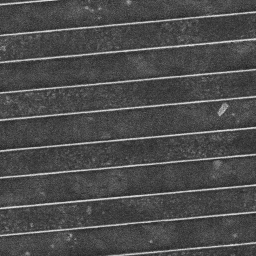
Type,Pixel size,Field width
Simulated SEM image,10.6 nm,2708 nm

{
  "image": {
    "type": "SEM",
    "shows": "parallel lines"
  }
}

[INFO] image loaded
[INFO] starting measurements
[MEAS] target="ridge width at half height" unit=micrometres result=0.287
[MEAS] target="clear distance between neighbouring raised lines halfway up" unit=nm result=317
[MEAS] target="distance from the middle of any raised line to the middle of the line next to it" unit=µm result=0.608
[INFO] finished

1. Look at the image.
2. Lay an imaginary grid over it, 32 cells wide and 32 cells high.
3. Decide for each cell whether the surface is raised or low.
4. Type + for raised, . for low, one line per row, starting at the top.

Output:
+...............................
................................
......................++++++++++
..........++++++++++++++++++++++
++++++++++++++++++++++++++++++++
+++++++++++++++++++++++++.......
++++++++++++++..................
+++.............................
................................
.......................+++++++++
............++++++++++++++++++++
.+++++++++++++++++++++++++++++++
+++++++++++++++++++++++++++.....
++++++++++++++++................
++++++..........................
................................
..........................++++++
...............+++++++++++++++++
....++++++++++++++++++++++++++++
++++++++++++++++++++++++++++++..
+++++++++++++++++++.............
++++++++........................
................................
............................++++
.................+++++++++++++++
......++++++++++++++++++++++++++
++++++++++++++++++++++++++++++++
+++++++++++++++++++++...........
++++++++++......................
................................
...............................+
....................++++++++++++